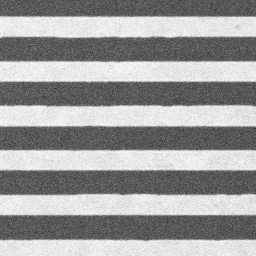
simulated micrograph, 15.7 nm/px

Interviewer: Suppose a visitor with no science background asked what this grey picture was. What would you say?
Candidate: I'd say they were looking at lines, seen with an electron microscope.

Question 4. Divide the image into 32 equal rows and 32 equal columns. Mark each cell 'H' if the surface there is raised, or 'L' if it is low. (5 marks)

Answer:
LLLLLLLLLLLLLLLLLLLLLLLLLLLLLLLL
LLLLLLLLLLLLLLLLLLLLLLLLLLLLLLLL
HHHHHHHHHHHHHHHHHHHHHHHHHHHHHHHH
HHHHHHHHHHHHHHHHHHHHHHHHHHHHHHHH
HLLLLLLHHHHHHLLHHHHLHHLLLLLLLLLL
LLLLLLLLLLLLLLLLLLLLLLLLLLLLLLLL
LLLLLLLLLLLLLLLLLLLLLLLLLLLLLLLL
LLLLLLLLLLLLLLLLLLLLLLLLLLLLLLLL
HHHHHHHHHHHHHHHHHHHHHHHHHHHHHHHH
HHHHHHHHHHHHHHHHHHHHHHHHHHHHHHHH
LLLLLLLLLLLLLLLLLLLLLLLLLLLLLLLL
LLLLLLLLLLLLLLLLLLLLLLLLLLLLLLLL
LLLLLLLLLLLLLLLLLLLLLLLLLLLLLLLL
HHHHHHHHHHHHHHHHHHHHHHHHHHHHHHHH
HHHHHHHHHHHHHHHHHHHHHHHHHHHHHHHH
HHHHHHHHHHHHHHHHHHHHHHHHHHHHHHHH
LLLLLLLLLLLLLLLLLLLLLLLLLLLLLLLL
LLLLLLLLLLLLLLLLLLLLLLLLLLLLLLLL
LLLLLLLLLLLLLLLLLLLLLLLLLLLLLLLL
HHHHHHHHHHHHHHHHHHHHHHHHHHHHHHHH
HHHHHHHHHHHHHHHHHHHHHHHHHHHHHHHH
LLLLLLLLLLLLLLLLLLLLLLLLLLLLLLLL
LLLLLLLLLLLLLLLLLLLLLLLLLLLLLLLL
LLLLLLLLLLLLLLLLLLLLLLLLLLLLLLLL
HHHHHHHHHHHHHHHHHHHHHHHHHHHHHHHH
HHHHHHHHHHHHHHHHHHHHHHHHHHHHHHHH
HHHHHHHHHHHHHHHHHHHHHHHHHHHHHHHH
LLLLLLLLLLLLLLLLLLLLLLLLLLLLLLLL
LLLLLLLLLLLLLLLLLLLLLLLLLLLLLLLL
LLLLLLLLLLLLLLLLLLLLLLLLLLLLLLLL
HHHHHHHHHHHHHHHHHHHHHHHHHHHHHHHH
HHHHHHHHHHHHHHHHHHHHHHHHHHHHHHHH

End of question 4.